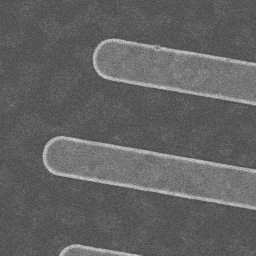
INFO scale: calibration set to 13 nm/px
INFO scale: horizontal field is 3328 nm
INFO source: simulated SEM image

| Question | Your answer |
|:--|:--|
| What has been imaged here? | one or a few lines or trenches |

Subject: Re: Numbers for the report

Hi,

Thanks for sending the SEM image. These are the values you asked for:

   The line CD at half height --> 0.48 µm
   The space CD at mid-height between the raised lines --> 0.869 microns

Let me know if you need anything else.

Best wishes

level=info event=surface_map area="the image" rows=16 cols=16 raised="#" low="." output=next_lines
................
................
................
......#######...
......##########
..........######
................
................
................
...######.......
...############.
.......#########
.............###
................
................
....##..........